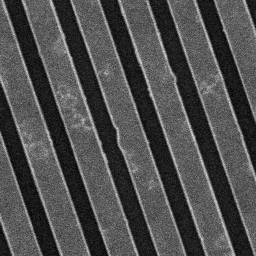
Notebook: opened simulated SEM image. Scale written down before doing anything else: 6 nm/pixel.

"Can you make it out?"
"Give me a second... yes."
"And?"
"parallel lines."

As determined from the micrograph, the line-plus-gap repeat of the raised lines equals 274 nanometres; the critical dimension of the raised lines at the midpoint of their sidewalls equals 165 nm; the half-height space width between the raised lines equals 0.109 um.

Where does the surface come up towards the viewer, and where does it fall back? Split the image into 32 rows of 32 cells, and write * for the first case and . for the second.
...****..****..****..****..****.
*..****..****..****..****..****.
*...***...***...***...***...***.
**..****..****..****..****..****
**..****..****..****..****..****
**...***...***...***...***...***
***..****..****..****..****..***
***..****..****..****..****..***
***...***...***...***...***...**
****..****..****..****..****..**
****..****..****..****..****..**
.***...***...***...***...***...*
.****..****..****..****..****..*
.****..****..****..****..****..*
..***...***...***...***...***...
..****..****..****..****..****..
..****..****...***..****...***..
...***...***...***...***...***..
*..****..****..****..****..****.
*..****..****...***...***...***.
*...***...***...***...***...***.
**..****..****..****..****..****
**..****..****...***...***...***
**...***...***...***...****..***
***..****..****..****..****..***
***..****..****...***...***...**
***...***...***...***...****..**
****..****..****..****..****..**
****..****..****...***...***...*
.***...***...***...***...****..*
.****..****..****..****..****..*
.****..****..****...***...***...